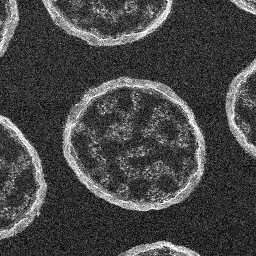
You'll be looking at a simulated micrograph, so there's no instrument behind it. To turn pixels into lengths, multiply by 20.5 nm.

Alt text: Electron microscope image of raised bodies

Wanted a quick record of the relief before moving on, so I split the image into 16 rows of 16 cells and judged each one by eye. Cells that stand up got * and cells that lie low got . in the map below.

*..*******......
*...******......
......*.........
................
................
.......***.....*
.....******...**
.....*******...*
*...********...*
**..********....
**...*******....
***...******....
**.....****.....
**..............
*...............
.........**.....